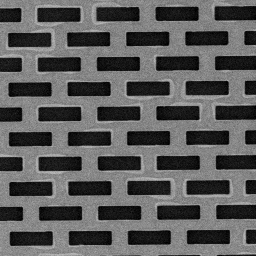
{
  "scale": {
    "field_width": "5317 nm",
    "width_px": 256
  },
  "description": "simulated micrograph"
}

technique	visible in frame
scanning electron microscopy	groups of lines, slits or small figures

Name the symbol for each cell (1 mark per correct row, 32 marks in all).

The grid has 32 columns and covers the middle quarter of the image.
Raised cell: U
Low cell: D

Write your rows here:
DDDDUUUUDDDDDDDDDDDUUUUDDDDDDDDD
DDDDUUUUDDDDDDDDDDDUUUUDDDDDDDDD
UUUUUUUUUUUUUUUUUUUUUUUUUUUUUUUU
UUUUUUUUUUUUUUUUUUUUUUUUUUUUUUUU
UDDDDDDDDDDUUUUUDDDDDDDDDDDUUUDD
UDDDDDDDDDDDUUUDDDDDDDDDDDDUUUDD
UDDDDDDDDDDDUUUDDDDDDDDDDDDUUUDD
UDDDDDDDDDDDUUUDDDDDDDDDDDDUUUDD
UUUUUUUUUUUUUUUUUDDDDUUUUUUUUUUD
UUUUUUUUUUUUUUUUUUUUUUUUUUUUUUUU
DDDDUUUUUDDDDDDDDDDUUUUDDDDDDDDD
DDDDDUUUDDDDDDDDDDDUUUUDDDDDDDDD
DDDDDUUUDDDDDDDDDDDUUUUDDDDDDDDD
DDDDDUUUDDDDDDDDDDDUUUUDDDDDDDDD
UUUUUUUUUDDDUUUUUUUUUUUUUUUUUUUU
UUUUUUUUUUUUUUUUUUUUUUUUUUUUUUUU
UUUUUUDDDDDDUUUUUUUUUUUDDDUUUUUD
UDDDDDDDDDDDUUUUDDDDDDDDDDDUUUDD
UDDDDDDDDDDDUUUUDDDDDDDDDDDUUUDD
UDDDDDDDDDDDUUUUDDDDDDDDDDDUUUDD
UUDDDDDDDDDUUUUUUUUUDDDUUUUUUUUU
UUUUUUUUUUUUUUUUUUUUUUUUUUUUUUUU
UUUUUUUUUUUUUUUUUUUUUUUUUUUUUUUU
DDDDUUUUUDDDDDDDDDDUUUUDDDDDDDDD
DDDDDUUUDDDDDDDDDDDUUUUDDDDDDDDD
DDDDDUUUDDDDDDDDDDDDUUUDDDDDDDDD
DDDDUUUUUDDDDDDDDDDDUUUDDDDDDDDD
UUUUUUUUUUUUUUUUUUUUUUUUUUUUUUUU
UUUUUUUUUUUUUUUUUUUUUUUUUUUUUUUU
UDDDDDDDDDDDUUUUDDDDDDDDDDDUUUDD
UDDDDDDDDDDDUUUUDDDDDDDDDDDUUUDD
UDDDDDDDDDDDUUUUDDDDDDDDDDDUUUDD